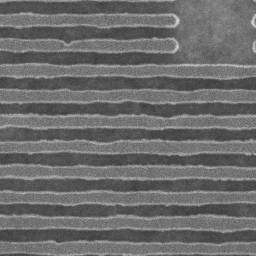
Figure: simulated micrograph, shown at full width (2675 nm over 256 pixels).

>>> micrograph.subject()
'parallel lines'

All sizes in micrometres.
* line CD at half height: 0.128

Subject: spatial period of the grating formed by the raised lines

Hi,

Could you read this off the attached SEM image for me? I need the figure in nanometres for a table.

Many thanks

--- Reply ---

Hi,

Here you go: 264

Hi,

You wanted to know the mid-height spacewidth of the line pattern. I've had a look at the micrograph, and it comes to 138 nanometres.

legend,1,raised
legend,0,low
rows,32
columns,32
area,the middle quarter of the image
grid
00011110000000000001111100111111
11111111111111111111111111111111
11111111111111111111111111111111
00000000000000000000000000000000
00000000000000000000000000000000
00000000000000000000000000000000
10000000000000111111110000000000
11111111111111111111111111111111
11111111111111111111111111111111
11111110000111000000111111111111
00000000000000000000000000000000
00000000000000000000000000000000
00000000000000000000000000000000
11111111111111111111111110011111
11111111111111111111111111111111
11111111111111111111111111111111
00000000000000000000000000000000
00000000000000000000000000000000
00000000000000000000000000000000
11111110000001111111111111110000
11111111111111111111111111111111
11111111111111111111111111111111
00000000000000000000000001111111
00000000000000000000000000000000
00000000000000000000000000000000
00000000000000000110011111000001
11111111111111111111111111111111
11111111111111111111111111111111
00000111111111111111111111111100
00000000000000000000000000000000
00000000000000000000000000000000
00000000000000000000000000000000